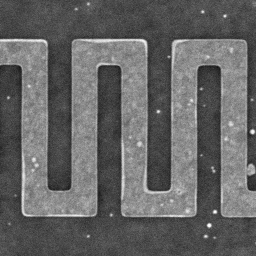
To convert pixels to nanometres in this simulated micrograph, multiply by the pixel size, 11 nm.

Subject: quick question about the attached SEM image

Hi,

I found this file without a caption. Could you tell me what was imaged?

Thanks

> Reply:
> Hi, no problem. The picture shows groups of lines, slits or small figures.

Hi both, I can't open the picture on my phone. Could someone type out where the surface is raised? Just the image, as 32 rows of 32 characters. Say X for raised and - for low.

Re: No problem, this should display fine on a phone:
--------------------------------
--------------------------------
--------------------------------
--------------------------------
--------------------------------
XXXXXX---XXXXXXXXX----XXXXXXXXX-
XXXXXX---XXXXXXXXX----XXXXXXXXX-
XXXXXX---XXXXXXXXX----XXXXXXXXX-
---XXX---XXX---XXX----XXX--XXXX-
---XXX---XXX---XXX----XXX---XXX-
---XXX---XXX---XXX----XXX---XXX-
---XXX---XXX---XXX----XX----XXX-
---XXX---XXX---XXX----XX----XXX-
---XXX---XXX---XXX----XX----XXX-
---XXX---XXX---XXX----XX----XXX-
---XXX---XXX---XXX----XX----XXX-
---XXX---XXX---XXX----XX----XXX-
---XXX---XXX---XXX----XX----XXX-
---XXX---XXX---XXX----XX----XXX-
---XXX---XXX---XXX----XX----XXX-
---XXX---XXX---XXX----XX----XXX-
---XXX---XXX---XXX----XX----XXX-
---XXX---XXX---XXX----XX----XXX-
---XXX---XXX---XXX---XXX----XXX-
---XXXXXXXXX---XXXXXXXXX----XXXX
---XXXXXXXXX---XXXXXXXXX----XXXX
---XXXXXXXXX---XXXXXXXXX----XXXX
--------------------------------
--------------------------------
--------------------------------
--------------------------------
--------------------------------